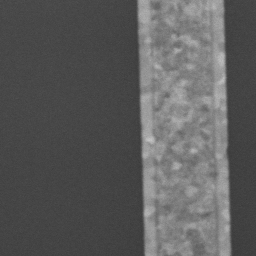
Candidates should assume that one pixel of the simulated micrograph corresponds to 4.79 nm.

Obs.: one or a few lines or trenches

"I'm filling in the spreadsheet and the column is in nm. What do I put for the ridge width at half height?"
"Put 351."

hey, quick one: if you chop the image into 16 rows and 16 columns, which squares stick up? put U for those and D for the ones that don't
DDDDDDDDDUUUUUDD
DDDDDDDDDUUUUUDD
DDDDDDDDDUUUUUDD
DDDDDDDDDUUUUUDD
DDDDDDDDDUUUUUDD
DDDDDDDDDUUUUUDD
DDDDDDDDDUUUUUDD
DDDDDDDDDUUUUUDD
DDDDDDDDDUUUUUDD
DDDDDDDDDUUUUUDD
DDDDDDDDDUUUUUDD
DDDDDDDDDUUUUUDD
DDDDDDDDDUUUUUDD
DDDDDDDDDUUUUUDD
DDDDDDDDDUUUUUDD
DDDDDDDDDUUUUUDD